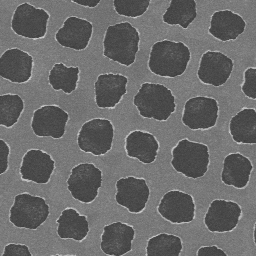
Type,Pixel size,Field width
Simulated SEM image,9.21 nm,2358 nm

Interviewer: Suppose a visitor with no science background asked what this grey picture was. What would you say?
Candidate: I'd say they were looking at a regular array of holes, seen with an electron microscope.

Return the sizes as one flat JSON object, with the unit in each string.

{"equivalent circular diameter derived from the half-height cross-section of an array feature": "319 nm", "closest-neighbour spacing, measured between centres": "0.426 micrometres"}